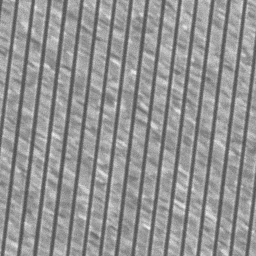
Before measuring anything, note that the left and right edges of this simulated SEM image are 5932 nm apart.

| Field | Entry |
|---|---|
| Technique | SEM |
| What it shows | parallel lines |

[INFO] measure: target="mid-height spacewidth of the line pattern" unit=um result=0.121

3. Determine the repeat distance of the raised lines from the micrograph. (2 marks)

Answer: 0.375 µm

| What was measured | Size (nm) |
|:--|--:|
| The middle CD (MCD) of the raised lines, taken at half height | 256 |